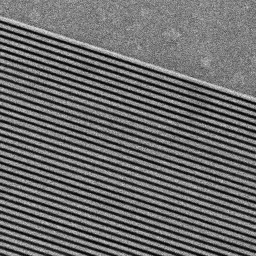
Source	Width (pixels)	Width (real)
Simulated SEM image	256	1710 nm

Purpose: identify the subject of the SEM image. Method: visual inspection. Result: parallel lines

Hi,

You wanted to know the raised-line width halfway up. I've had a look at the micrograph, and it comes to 26.2 nanometres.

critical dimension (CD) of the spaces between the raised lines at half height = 0.0198 µm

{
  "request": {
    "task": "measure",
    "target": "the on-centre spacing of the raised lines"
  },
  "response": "44.8 nm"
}